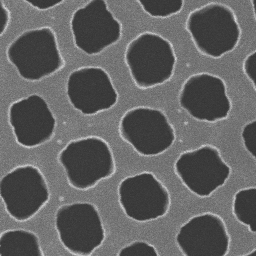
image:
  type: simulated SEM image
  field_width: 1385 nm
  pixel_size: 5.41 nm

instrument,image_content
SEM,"a regular array of holes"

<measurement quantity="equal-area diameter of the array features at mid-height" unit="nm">255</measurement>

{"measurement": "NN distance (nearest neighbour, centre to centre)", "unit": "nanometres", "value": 359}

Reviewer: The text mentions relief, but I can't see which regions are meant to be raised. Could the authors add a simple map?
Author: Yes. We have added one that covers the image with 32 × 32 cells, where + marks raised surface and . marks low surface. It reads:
++++...++++..+++++.....+++++++++
.+++++++++....++++....+++....+++
.++++++++.....++++++++++.....+++
.++++++++......+++++++++......++
+++....++......+++.+++++......++
++.....+++....+++....++++....+++
+......++++.++++.....+++++..++++
+......+++++++++......+++++++++.
++.....+++++++++......+++++++++.
+++..++++....++++....++++.+++++.
+++++++++.....++++.++++.....++++
+++++++++.....+++++++++.....++++
+++..++++......++++++++.....++++
+.....++++....+++++++++......+++
+......+++++++++....++++....++++
+......++++++++......++++++++++.
++....++++++++++......++++++++..
++....+++++.++++......+++++++++.
++++++++.....++++....++++++++++.
++++++++......+++++++++....+++++
++++++++......++++++++......++++
++...+++......++++++++.......+++
.....++++...++++...++++.....++++
......+++++++++.....++++...+++++
......+++++++++......+++++++++..
+....++++..++++......++++++++...
+...+++.....++++.....++++++++...
+++++++......++++.++++++...+++..
+++++++......++++++++++.....+++.
....++++.....+++++++++......++++
.....+++....+++++.++++......++++
.....+++++.++++....++++.....++++